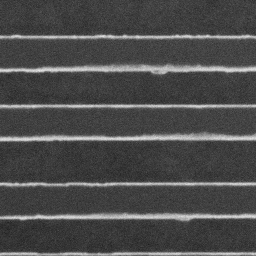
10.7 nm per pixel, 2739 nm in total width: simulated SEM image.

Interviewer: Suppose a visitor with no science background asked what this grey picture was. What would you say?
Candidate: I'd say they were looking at lines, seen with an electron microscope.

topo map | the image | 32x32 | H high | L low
LLLLLLLLLLLLLLLLLLLLLLLLLLLLLLLL
LLLLLLLLLLLLLLLLLLLLLLLLLLLLLLLL
LLLLLLLLLLLLLLLLLLLLLLLLLLLLLLLL
LLLLLLLLLLLLLLLLLLLLLLLLLLLLLLLL
LHHLLLLLLLLLHHLLLLLLLLLHLLLLLLHL
HHHHHHHHHHHHHHHHHHHHHHHHHHHHHHHH
HHHHHHHHHHHHHHHHHHHHHHHHHHHHHHHH
HHHHHHHHHHHHHHHHHHHHHHHHHHHHHHHH
HHHHHHHHHHHHHHHHHHHHHHHHHHHHHHHH
LLLLLLLLLLLLLLLLLLLLLLLLLLLLLLLL
LLLLLLLLLLLLLLLLLLLLLLLLLLLLLLLL
LLLLLLLLLLLLLLLLLLLLLLLLLLLLLLLL
LLLLLLLLLLLLLLLLLLLLLLLLLLLLLLLL
HHHHHHHHHHHHHHHHHHHHHHHHHHHHHHHH
HHHHHHHHHHHHHHHHHHHHHHHHHHHHHHHH
HHHHHHHHHHHHHHHHHHHHHHHHHHHHHHHH
HHHHHHHHHHHHHHHHHHHHHHHHHHHHHHHH
LLLLLLLLLLLLLLLLLLLLLLLLLLLLLLLL
LLLLLLLLLLLLLLLLLLLLLLLLLLLLLLLL
LLLLLLLLLLLLLLLLLLLLLLLLLLLLLLLL
LLLLLLLLLLLLLLLLLLLLLLLLLLLLLLLL
LLLLLLLLLLLLLLLLLLLLLLLLLLLLLLLL
LLLLLLLLLLLLLLLLLLLLLLLLLLLLLLLL
HHHHHHHHHHHHHHHHHHHHHHHHHHHHHHHH
HHHHHHHHHHHHHHHHHHHHHHHHHHHHHHHH
HHHHHHHHHHHHHHHHHHHHHHHHHHHHHHHH
HHHHHHHHHHHHHHHHHHHHHHHHHHHHHHHH
LLLLLLLLLLLLLLLLLLLLLLLLLLLLLLLL
LLLLLLLLLLLLLLLLLLLLLLLLLLLLLLLL
LLLLLLLLLLLLLLLLLLLLLLLLLLLLLLLL
LLLLLLLLLLLLLLLLLLLLLLLLLLLLLLLL
LLLLLLLLLLLLLLLLLLLLLLLLLLLLLLLL